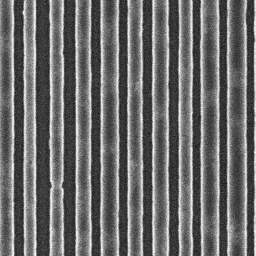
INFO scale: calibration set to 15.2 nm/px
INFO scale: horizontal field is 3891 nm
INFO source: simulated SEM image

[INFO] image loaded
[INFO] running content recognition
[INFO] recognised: parallel lines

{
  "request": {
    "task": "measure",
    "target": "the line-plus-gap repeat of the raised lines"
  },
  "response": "393 nm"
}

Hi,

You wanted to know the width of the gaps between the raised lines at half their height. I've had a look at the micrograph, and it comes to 160 nm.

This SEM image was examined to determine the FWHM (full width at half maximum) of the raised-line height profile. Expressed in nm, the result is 218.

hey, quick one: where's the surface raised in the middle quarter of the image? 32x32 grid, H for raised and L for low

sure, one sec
LLLHHHLLLHHHHLLLHHHLLLHHHHLLLHHH
LLLHHHHLLHHHHLLLHHHLLLHHHHLLLHHH
LLLHHHHLLHHHHHLLHHHLLLHHHHLLLHHH
LLLHHHHLLHHHHHLLHHHLLLHHHHLLLHHH
LLLHHHHLLHHHHLLLHHHLLLHHHHLLLHHH
LLLHHHHLLHHHHLLLHHHLLLHHHHLLLHHH
LLLHHHHLLHHHHLLLHHHLLLHHHHLLLHHH
LLLHHHHLLHHHHLLLHHHLLLHHHHLLLHHH
LLLHHHHLLHHHHHLLHHHHLLHHHHLLLHHH
LLLHHHHLLHHHHHLLHHHHLLHHHHLLLHHH
LLLHHHHLLHHHHHLLHHHLLLHHHHLLLHHH
LLLHHHHLLHHHHLLLHHHLLLHHHHLLLHHH
LLLHHHHLLHHHHHLLHHHLLLHHHHLLLHHH
LLLHHHHLLHHHHHLLHHHLLLHHHHLLLHHH
LLLHHHHLLHHHHHLLHHHHLLHHHHLLLHHH
LLLHHHHLLLHHHHLLHHHHLLHHHHLLLHHH
LLLHHHHLLHHHHHLLHHHHLLHHHHLLLHHH
LLLHHHHLLHHHHHLLHHHLLLHHHHLLLHHH
LLLHHHHLLHHHHHLLHHHLLLHHHHLLLHHH
LLLHHHHLLLHHHHLLHHHLLLHHHHLLLHHH
LLLHHHHLLLHHHHLLHHHLLLHHHHLLLHHH
LLLHHHHLLLHHHHLLHHHLLLHHHHLLLHHH
LLLHHHHLLLHHHHLLHHHLLLHHHHLLLHHH
LLLHHHHLLLHHHHLLHHHHLLHHHHLLLHHH
LLLHHHHLLLHHHLLLHHHHLLHHHHLLLHHH
LLLHHHLLLLHHHHLLHHHHLLHHHHLLLHHH
LLLHHHLLLLHHHHLLHHHHLLHHHHLLLHHH
LLLHHHLLLLHHHLLLHHHLLLHHHHLLLHHH
LLLHHHLLLHHHHLLLHHHLLLHHHHLLLHHH
LLLHHHLLLHHHHLLLHHHLLLHHHHLLLHHH
LLLHHHHLLHHHHHLLHHHHLLHHHHLLLHHH
LLLHHHHLLLHHHLLLHHHHLLHHHHLLLHHH